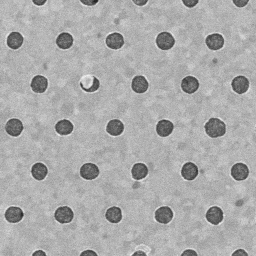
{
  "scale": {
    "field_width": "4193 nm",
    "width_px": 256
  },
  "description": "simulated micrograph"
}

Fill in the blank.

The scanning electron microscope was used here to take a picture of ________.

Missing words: a regular array of holes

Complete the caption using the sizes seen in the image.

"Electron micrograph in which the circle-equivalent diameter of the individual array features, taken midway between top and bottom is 302 nanometers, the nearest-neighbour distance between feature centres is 817 nanometers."